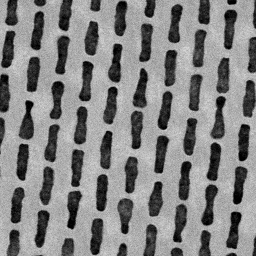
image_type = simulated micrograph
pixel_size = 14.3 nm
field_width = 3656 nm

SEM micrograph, a regular array of holes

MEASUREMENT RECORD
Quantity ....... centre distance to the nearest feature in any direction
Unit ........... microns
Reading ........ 0.482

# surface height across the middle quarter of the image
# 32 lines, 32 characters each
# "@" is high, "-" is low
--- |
@@@@@--@@@@@--@@@@@@@@@@@---@@@@
@@@@---@@@@---@@@@@-@@@@@---@@@@
@@@@---@@@@---@@@@@--@@@@---@@@@
@@@@@--@@@@---@@@@@--@@@@---@@@@
@@@@@--@@@@@--@@@@---@@@@---@@@@
@@@@@--@@@@@@@@@@@---@@@@@-@@@@-
@@@@---@@@@--@@@@@--@@@@@@@@@@@-
@@@@---@@@@---@@@---@@@@@--@@@@-
@@@@---@@@@--@@@@---@@@@@--@@@@-
@@@@@@@@@@@--@@@@----@@@---@@@@-
@@@@@@@@@@---@@@@@---@@@---@@@@-
@@@---@@@@---@@@@@@@@@@@---@@@@@
@@@---@@@@---@@@@---@@@@---@@@@@
@@@---@@@@---@@@@---@@@@--@@@@@@
@@@---@@@@--@@@@@---@@@---@@@@@-
@@@---@@@@@@@@@@@---@@@---@@@@@-
@@@---@@@@@@@@@@@---@@@@@@@@@@--
@@@---@@@@--@@@@@--@@@@@@@@@@@--
@@----@@@@--@@@@@--@@@@---@@@@--
@@@--@@@@---@@@@@--@@@@---@@@@--
@@@@@@@@@---@@@@@--@@@@---@@@@--
@@--@@@@@---@@@@@@@@@@@---@@@@--
@@---@@@@---@@@@@@@@@@@--@@@@@--
@@---@@@@---@@@@--@@@@@--@@@@@@@
@@---@@@@---@@@@---@@@@--@@@@@-@
@@---@@@@---@@@---@@@@@--@@@@---
@@--@@@@@@@@@@@---@@@@@--@@@@---
@@--@@@@@@@@@@@---@@@@@@@@@@@--@
@@--@@@@@--@@@@---@@@@@@@@@@@--@
@@--@@@@---@@@@---@@@@@-@@@@@---
@@--@@@@---@@@@---@@@@@--@@@@--@
@@@@@@@@---@@@@---@@@@---@@@@--@